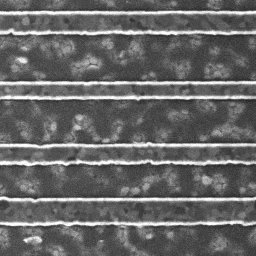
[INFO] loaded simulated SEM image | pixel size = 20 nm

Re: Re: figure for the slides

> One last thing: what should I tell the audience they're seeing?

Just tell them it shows one or a few lines or trenches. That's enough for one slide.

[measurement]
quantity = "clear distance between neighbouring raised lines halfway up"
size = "956 nanometers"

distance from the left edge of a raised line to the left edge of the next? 1260 nm